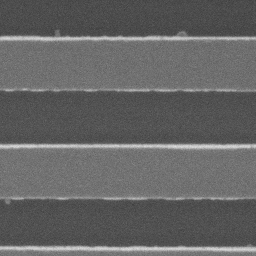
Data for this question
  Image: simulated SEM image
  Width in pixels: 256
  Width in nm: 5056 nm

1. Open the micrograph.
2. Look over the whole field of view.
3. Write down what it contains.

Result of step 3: lines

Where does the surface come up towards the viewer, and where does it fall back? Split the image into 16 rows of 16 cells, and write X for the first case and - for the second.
----------------
----------------
XXXXXXXXXXXXXXXX
XXXXXXXXXXXXXXXX
XXXXXXXXXXXXXXXX
XXXXXXXXXXXXXXXX
----------------
----------------
----------------
XXXXXXXXXXXXXXXX
XXXXXXXXXXXXXXXX
XXXXXXXXXXXXXXXX
----------------
----------------
----------------
XXXXXXXXXXXXXX--